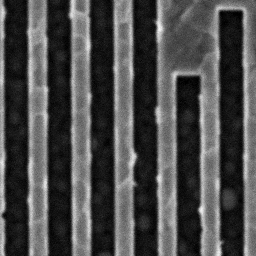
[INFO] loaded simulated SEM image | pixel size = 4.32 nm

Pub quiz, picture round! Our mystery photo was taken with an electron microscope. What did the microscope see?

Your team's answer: parallel lines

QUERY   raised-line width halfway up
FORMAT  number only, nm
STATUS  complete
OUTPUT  76.8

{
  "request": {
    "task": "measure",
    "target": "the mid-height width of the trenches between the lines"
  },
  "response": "107 nanometers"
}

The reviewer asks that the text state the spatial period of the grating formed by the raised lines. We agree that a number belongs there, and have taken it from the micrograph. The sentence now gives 185 nanometers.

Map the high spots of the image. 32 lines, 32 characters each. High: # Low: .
....##...##...##....############
#...##...##...##....#######...##
#...##...##...##....#######...##
....##...##...###...#######...##
#...##...##...###...#######...##
....##...##...###...#######...##
....##...##...###...#######...##
....##...##...##....#######...##
....##...##...###...#######...##
....##...##...###...##...##....#
....##...##...###...##...##....#
....##...##...##....##...##...##
....##...##...##....##...##...##
....##...##...##...###...##....#
....##...##...##...###...##....#
....##...##...##....##...##....#
....##...##...##....##...##....#
....##...##...##....##...##....#
....##...##...###...##...##....#
#...##...##...###...##...##...##
#...##...##...###...##...##....#
#...##...##...###...##...##...##
....##...##...###...##...##....#
....##...##...###...##...##....#
#...##...##...###...##...##....#
#...##...##...###...##...##....#
....##...##...###...##...##....#
....##...##...###...##...##....#
....##...##....##...##...##....#
#...##...##....##...##...##....#
#...##...##...###...##...###...#
#...##...##...###...##...###...#